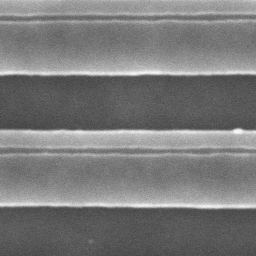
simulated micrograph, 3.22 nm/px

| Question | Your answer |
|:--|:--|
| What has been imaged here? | lines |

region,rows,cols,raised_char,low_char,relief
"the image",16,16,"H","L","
HHHHHHHHHHHHHHHH
HHHHHHHHHHHHHHHH
HHHHHHHHHHHHHHHH
HHHHHHHHHHHHHHHH
HHHHHHHHHHHHHHHH
LLLLLLLLLLLLLLLL
LLLLLLLLLLLLLLLL
LLLLLLLLLLLLLLLL
HHHHHHHHHHHHHHHH
HHHHHHHHHHHHHHHH
HHHHHHHHHHHHHHHH
HHHHHHHHHHHHHHHH
HHHHHHHHHHHHHHHH
LLLLLLLLLLLLLLLL
LLLLLLLLLLLLLLLL
LLLLLLLLLLLLLLLL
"